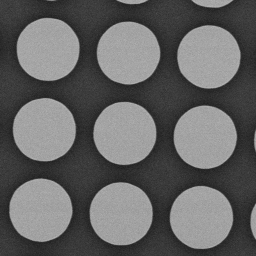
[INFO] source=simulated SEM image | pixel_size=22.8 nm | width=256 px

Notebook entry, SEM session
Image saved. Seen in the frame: an array of small figures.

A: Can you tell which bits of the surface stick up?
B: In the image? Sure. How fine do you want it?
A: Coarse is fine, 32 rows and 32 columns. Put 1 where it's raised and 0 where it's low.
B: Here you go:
00000000000000000000000001110000
00000000000000000000000000000000
00000110000000000000000000000000
00011111100000111100000001110000
00111111110001111110000111111000
00111111110011111111000111111100
00111111110011111111001111111100
00111111110011111111001111111100
00011111100001111110001111111100
00001111000001111110000111111000
00000000000000001000000011110000
00000000000000000000000000000000
00001110000000000000000000000000
00011111000001111100000011100000
00111111100011111110000111111000
00111111100011111110001111111000
00111111100011111110001111111100
00111111100011111110001111111100
00111111100011111110001111111000
00011111000001111100000111111000
00000000000000010000000011110000
00000000000000000000000000000000
00001100000000000000000000000000
00111111000001111000000011000000
00111111100011111100001111110000
01111111100111111110001111111000
01111111100111111110011111111001
01111111100111111110011111111001
00111111000011111110011111111001
00011110000011111100001111110000
00000000000000110000000111100000
00000000000000000000000000000000